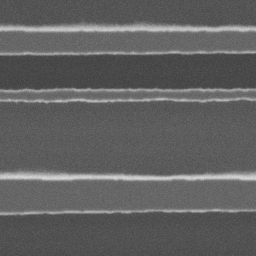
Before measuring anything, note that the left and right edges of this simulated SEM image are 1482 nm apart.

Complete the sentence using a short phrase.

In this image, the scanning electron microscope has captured lines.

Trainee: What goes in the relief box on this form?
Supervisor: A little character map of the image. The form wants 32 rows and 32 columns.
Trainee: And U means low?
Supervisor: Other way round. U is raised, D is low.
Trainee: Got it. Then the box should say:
DDDDDDDDDDDDDDDDDDDDDDDDDDDDDDDD
DDDDDDDDDDDDDDDDDDDDDDDDDDDDDDDD
DDDDDDDDDDDDDDDDDDDDDDDDDDDDDDDD
DDDDDDDDDDDDDDDDDDDDDDDDDDDDDDDD
UUUUUUUUUUUUUUUUUUUUUUUUUUUUUUUU
UUUUUUUUUUUUUUUUUUUUUUUUUUUUUUUU
UUUUUUUUUUUUUUUUUUUUUUUUUUUUUUUU
DDDDDDDDDDDDDDDDDDDDDDDDDDDDDDDD
DDDDDDDDDDDDDDDDDDDDDDDDDDDDDDDD
DDDDDDDDDDDDDDDDDDDDDDDDDDDDDDDD
DDDDDDDDDDDDDDDDDDDDDDDDDDDDDDDD
UUUUUUUUUUUUUUUUUUUUUUUUUUUUUUUU
UUUUUUUUUUUUUUUUUUUDDDUUUUUUUDDD
DDDDDDDDDDDDDDDDDDDDDDDDDDDDDDDD
DDDDDDDDDDDDDDDDDDDDDDDDDDDDDDDD
DDDDDDDDDDDDDDDDDDDDDDDDDDDDDDDD
DDDDDDDDDDDDDDDDDDDDDDDDDDDDDDDD
DDDDDDDDDDDDDDDDDDDDDDDDDDDDDDDD
DDDDDDDDDDDDDDDDDDDDDDDDDDDDDDDD
DDDDDDDDDDDDDDDDDDDDDDDDDDDDDDDD
DDDDDDDDDDDDDDDDDDDDDDDDDDDDDDDD
DDDDDDDDDDDDDDDDDDDDDDDDDDDDDDDD
UUUUUUUUUUUUUUUUUUUUUUUUUUUUUUUU
UUUUUUUUUUUUUUUUUUUUUUUUUUUUUUUU
UUUUUUUUUUUUUUUUUUUUUUUUUUUUUUUU
UUUUUUUUUUUUUUUUUUUUUUUUUUUUUUUU
UUUUUUUUUUUUDUUDDDDDDDDDDDDDDDDD
DDDDDDDDDDDDDDDDDDDDDDDDDDDDDDDD
DDDDDDDDDDDDDDDDDDDDDDDDDDDDDDDD
DDDDDDDDDDDDDDDDDDDDDDDDDDDDDDDD
DDDDDDDDDDDDDDDDDDDDDDDDDDDDDDDD
DDDDDDDDDDDDDDDDDDDDDDDDDDDDDDDD